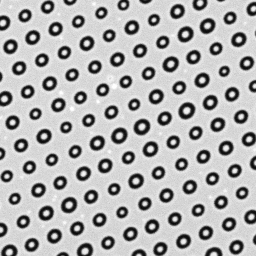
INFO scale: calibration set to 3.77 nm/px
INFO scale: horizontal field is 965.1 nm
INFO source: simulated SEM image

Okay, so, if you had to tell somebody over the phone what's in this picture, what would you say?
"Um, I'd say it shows a regular array of ring-shaped grooves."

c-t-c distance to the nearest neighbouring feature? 0.0888 micrometres